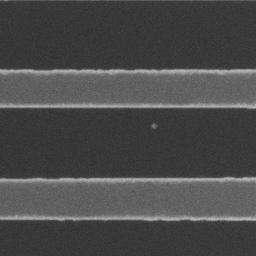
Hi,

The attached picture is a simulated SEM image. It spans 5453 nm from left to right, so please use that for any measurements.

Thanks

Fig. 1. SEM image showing lines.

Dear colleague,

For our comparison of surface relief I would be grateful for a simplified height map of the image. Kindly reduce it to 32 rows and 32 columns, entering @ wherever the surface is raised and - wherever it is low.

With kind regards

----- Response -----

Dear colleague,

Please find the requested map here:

--------------------------------
--------------------------------
--------------------------------
--------------------------------
--------------------------------
--------------------------------
--------------------------------
--------------------------------
--------------------------------
@@@@@@@@@@@@@@@@@@@@@@@@@@@@@@@@
@@@@@@@@@@@@@@@@@@@@@@@@@@@@@@@@
@@@@@@@@@@@@@@@@@@@@@@@@@@@@@@@@
@@@@@@@@@@@@@@@@@@@@@@@@@@@@@@@@
--------------------------------
--------------------------------
--------------------------------
--------------------------------
--------------------------------
--------------------------------
--------------------------------
--------------------------------
--------------------------------
@@@@@@@@@@@@@@@@@@@@@@@@@@@@@@@@
@@@@@@@@@@@@@@@@@@@@@@@@@@@@@@@@
@@@@@@@@@@@@@@@@@@@@@@@@@@@@@@@@
@@@@@@@@@@@@@@@@@@@@@@@@@@@@@@@@
@@@@@@@@@@@@@@@@@@@@@@@@@@@@@@@@
--------------------------------
--------------------------------
--------------------------------
--------------------------------
--------------------------------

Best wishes